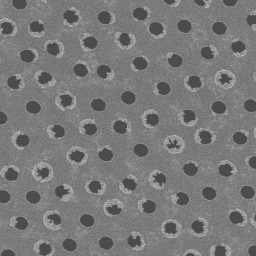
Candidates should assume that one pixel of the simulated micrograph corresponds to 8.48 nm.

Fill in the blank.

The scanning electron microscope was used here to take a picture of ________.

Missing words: a regular array of holes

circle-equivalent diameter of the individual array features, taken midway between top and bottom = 110 nanometers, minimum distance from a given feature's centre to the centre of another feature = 0.241 micrometres